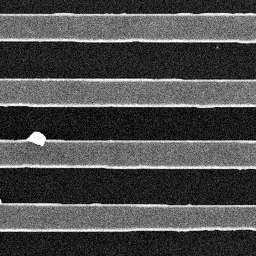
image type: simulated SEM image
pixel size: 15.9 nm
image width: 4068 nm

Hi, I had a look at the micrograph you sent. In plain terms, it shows lines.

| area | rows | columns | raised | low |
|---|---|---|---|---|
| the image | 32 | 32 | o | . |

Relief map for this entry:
................................
................................
oooooooooooooooooooooooooooooooo
oooooooooooooooooooooooooooooooo
oooooooooooooooooooooooooooooooo
................................
................................
................................
................................
................................
oooooooooooooooooooooooooooooooo
oooooooooooooooooooooooooooooooo
oooooooooooooooooooooooooooooooo
................................
................................
................................
................................
...ooo..........................
oooooooooooooooooooooooooooooooo
oooooooooooooooooooooooooooooooo
oooooooooooooooooooooooooooooooo
................................
................................
................................
................................
oooooooo...oo...................
oooooooooooooooooooooooooooooooo
oooooooooooooooooooooooooooooooo
oooooooooooooooooooooooooooooooo
................................
................................
................................